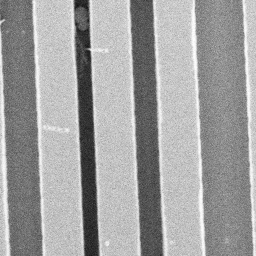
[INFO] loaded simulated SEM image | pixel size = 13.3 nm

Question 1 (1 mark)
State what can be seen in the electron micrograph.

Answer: lines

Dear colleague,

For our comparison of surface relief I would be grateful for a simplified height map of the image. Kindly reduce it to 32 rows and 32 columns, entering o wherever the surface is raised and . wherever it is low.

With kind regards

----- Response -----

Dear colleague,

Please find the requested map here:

....ooooo..ooooo...ooooo......oo
....ooooo..ooooo...ooooo.......o
....ooooo..ooooo...ooooo.......o
....ooooo..ooooo...ooooo.......o
....ooooo..ooooo...ooooo.......o
....ooooo..ooooo....oooo.......o
.....oooo..ooooo....oooo.......o
.....oooo..ooooo....oooo.......o
.....oooo...ooooo...oooo.......o
.....ooooo..ooooo...ooooo......o
.....ooooo..ooooo...ooooo......o
.....ooooo..ooooo...ooooo......o
.....ooooo..ooooo...ooooo......o
.....ooooo..ooooo...ooooo......o
.....ooooo..ooooo...ooooo......o
.....ooooo..ooooo...ooooo......o
.....ooooo..ooooo...ooooo......o
.....ooooo..ooooo...ooooo......o
o....ooooo..ooooo...ooooo......o
o....ooooo..ooooo...ooooo......o
o....ooooo..ooooo...ooooo......o
o....ooooo..ooooo...ooooo......o
o....ooooo..ooooo...ooooo......o
o....ooooo..ooooo...ooooo......o
o....ooooo..ooooo...ooooo......o
o....ooooo..ooooo...ooooo.......
o....ooooo..ooooo...ooooo.......
o....ooooo..ooooo...ooooo.......
o....ooooo..ooooo...ooooo.......
o....ooooo..ooooo....oooo.......
o....ooooo..ooooo....oooo.......
o.....oooo..ooooo....oooo.......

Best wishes